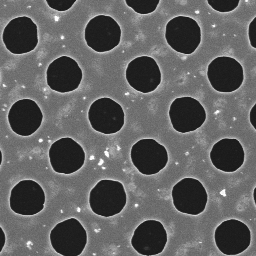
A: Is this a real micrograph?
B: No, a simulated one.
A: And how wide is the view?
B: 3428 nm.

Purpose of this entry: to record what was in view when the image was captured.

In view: a regular array of holes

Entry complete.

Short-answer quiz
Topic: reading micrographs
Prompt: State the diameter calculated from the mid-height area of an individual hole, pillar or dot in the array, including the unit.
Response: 485 nanometres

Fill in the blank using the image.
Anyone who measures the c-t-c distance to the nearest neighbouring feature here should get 757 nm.